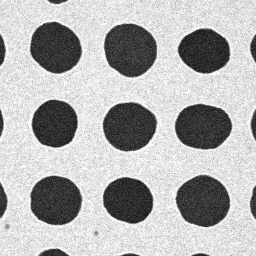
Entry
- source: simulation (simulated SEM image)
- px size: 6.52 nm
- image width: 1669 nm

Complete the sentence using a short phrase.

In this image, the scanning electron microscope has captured a regular array of holes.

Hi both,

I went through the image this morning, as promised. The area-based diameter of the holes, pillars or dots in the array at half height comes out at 333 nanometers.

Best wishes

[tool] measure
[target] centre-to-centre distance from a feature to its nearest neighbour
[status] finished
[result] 483 nanometers